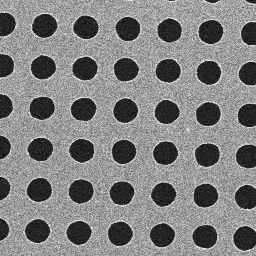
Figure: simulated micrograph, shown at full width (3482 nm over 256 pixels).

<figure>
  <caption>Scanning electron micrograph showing a regular array of holes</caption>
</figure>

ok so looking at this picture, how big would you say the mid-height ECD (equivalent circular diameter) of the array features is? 333 nm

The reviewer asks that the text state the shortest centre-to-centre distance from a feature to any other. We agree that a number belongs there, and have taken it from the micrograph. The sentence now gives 0.556 um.